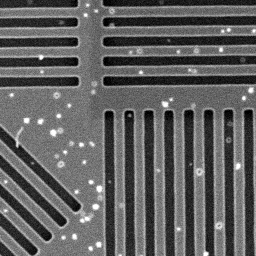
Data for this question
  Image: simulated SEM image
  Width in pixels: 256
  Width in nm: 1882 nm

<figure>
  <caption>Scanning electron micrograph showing groups of lines, slits or small figures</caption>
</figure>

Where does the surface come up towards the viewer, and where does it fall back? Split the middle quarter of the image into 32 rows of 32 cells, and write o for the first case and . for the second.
...ooooooo......................
oooooooooooooooooooooooooooooooo
oooooooooooooooooooooooooooooooo
....oooooo......................
....oooooo......................
...ooooooo..........oooooooooooo
oooooooooooooooooooooooooooooooo
oooooooooooooooooooooooooooooooo
oooooooooooooooooooooooooooooooo
oooooooooooooooooooooooooooooooo
oooooooooooooooooooooooooooooooo
ooooooooooooooooooooooooooooooo.
oooooooooo...oo...oo...oo...oo..
oooooooooo...oo...oo...oo...oo..
oooooooooo...oo...oo...oo...oo..
oooooooooo...oo...oo...oo...oo..
oooooooooo...oo...oo...oo...oo..
oooooooooo...oo...oo...oo...oo..
oooooooooo...oo...oo...oo...oo..
oooooooooo...oo...oo...oo...oo..
oooooooooo...oo...oo...oo...oo..
oooooooooo...oo...oo...oo...oo..
oooooooooo...oo...oo...oo...oo..
oooooooooo...oo...oo...oo...oo..
oooooooooo...oo...oo...oo...oo..
oooooooooo...oo...oo...oo...oo..
oooooooooo...oo...oo...oo...oo..
oooooooooo...oo...oo...oo...oo..
oooooooooo...oo...oo...oo...oo..
oooooooooo...oo...oo...oo...oo..
oooooooooo...oo...oo...oo...oo..
.ooooooooo...oo...oo...oo...oo..